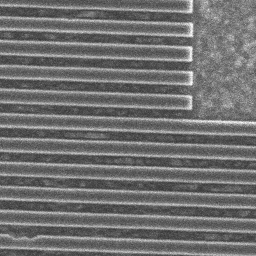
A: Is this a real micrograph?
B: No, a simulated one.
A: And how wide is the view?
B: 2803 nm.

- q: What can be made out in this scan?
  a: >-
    parallel lines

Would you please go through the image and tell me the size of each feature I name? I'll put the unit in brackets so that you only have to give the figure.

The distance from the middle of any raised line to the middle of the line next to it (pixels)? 24.2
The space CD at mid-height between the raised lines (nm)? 119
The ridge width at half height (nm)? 138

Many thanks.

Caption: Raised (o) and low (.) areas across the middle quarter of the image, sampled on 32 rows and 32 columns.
................................
oooooooooooo....................
oooooooooooooooooooooooooooooooo
oooooooooooooooooooooooooooooooo
..............oooooooooooooooooo
................................
................................
oooooooooooooooo................
oooooooooooooooooooooooooooooooo
oooooooooooooooooooooooooooooooo
...........ooooooooooooooooooooo
................................
................................
ooooooooooooo...................
oooooooooooooooooooooooooooooooo
oooooooooooooooooooooooooooooooo
...............ooooooooooooooooo
................................
................................
ooooooooooo.....................
oooooooooooooooooooooooooooooooo
oooooooooooooooooooooooooooooooo
......oooooooooooooooooooooooooo
................................
................................
oooooooo........................
oooooooooooooooooooooooooooooooo
oooooooooooooooooooooooooooooooo
.....o..oooooooooooooooooooooooo
................................
................................
oooooo..........................